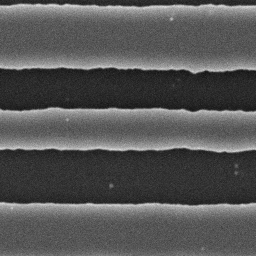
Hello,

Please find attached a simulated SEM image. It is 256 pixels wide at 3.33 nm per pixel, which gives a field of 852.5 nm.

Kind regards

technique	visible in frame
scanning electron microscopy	lines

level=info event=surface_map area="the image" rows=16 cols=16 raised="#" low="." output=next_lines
################
################
################
################
................
................
................
################
################
................
................
................
................
################
################
################